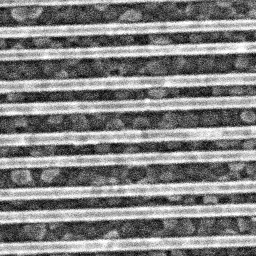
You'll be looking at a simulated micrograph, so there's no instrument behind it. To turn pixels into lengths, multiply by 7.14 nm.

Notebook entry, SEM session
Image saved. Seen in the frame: parallel lines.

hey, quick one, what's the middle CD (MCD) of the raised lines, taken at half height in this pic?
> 66.9 nm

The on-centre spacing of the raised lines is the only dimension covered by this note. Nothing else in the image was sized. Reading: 0.193 microns